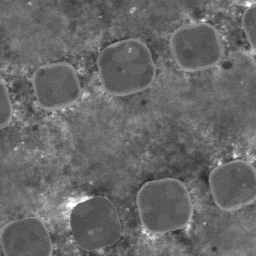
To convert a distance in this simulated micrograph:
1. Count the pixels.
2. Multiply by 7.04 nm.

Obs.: raised bodies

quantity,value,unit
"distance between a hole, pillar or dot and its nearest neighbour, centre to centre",513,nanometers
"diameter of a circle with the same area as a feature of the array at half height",365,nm